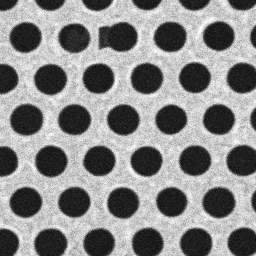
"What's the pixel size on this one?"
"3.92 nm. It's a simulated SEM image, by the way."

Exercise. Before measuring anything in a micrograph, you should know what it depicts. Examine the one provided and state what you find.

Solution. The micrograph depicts a regular array of holes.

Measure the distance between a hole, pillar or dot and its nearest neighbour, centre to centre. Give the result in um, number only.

0.186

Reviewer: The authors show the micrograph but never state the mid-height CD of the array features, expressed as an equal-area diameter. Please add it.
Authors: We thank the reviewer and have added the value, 123 nm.